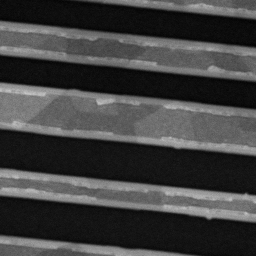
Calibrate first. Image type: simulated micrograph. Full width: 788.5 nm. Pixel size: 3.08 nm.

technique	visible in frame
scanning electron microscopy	one or a few lines or trenches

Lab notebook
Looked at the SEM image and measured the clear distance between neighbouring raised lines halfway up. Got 137 nm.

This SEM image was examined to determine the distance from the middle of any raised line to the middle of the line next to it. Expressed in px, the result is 71.6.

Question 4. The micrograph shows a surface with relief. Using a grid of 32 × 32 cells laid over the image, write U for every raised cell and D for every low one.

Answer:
DDDDDDDDDDDDDDDDDDUUUUUUUUUUUUUU
DDDDDDDDDDDDDDDDDDDDDDDDDDDDUUUU
DDDDDDDDDDDDDDDDDDDDDDDDDDDDDDDD
UUUUDDDDDDDDDDDDDDDDDDDDDDDDDDDD
UUUUUUUUUUUUUUDDDDDDDDDDDDDDDDDD
UUUUUUUUUUUUUUUUUUUUUUUDDDDDDDDD
DUUUUUUUUUUUUUUUUUUUUUUUUUUUUUUU
DDDDDDDDDDDUUUUUUUUUUUUUUUUUUUUU
DDDDDDDDDDDDDDDDDDDDUUUUUUUUUUUU
DDDDDDDDDDDDDDDDDDDDDDDDDDDDDDUU
DDDDDDDDDDDDDDDDDDDDDDDDDDDDDDDD
UUUUUUUDDDDDDDDDDDDDDDDDDDDDDDDD
UUUUUUUUUUUUUUUUDDDDDDDDDDDDDDDD
UUUUUUUUUUUUUUUUUUUUUUUUUUDDDDDD
UUUUUUUUUUUUUUUUUUUUUUUUUUUUUUUU
UUUUUUUUUUUUUUUUUUUUUUUUUUUUUUUU
DDDDDDDDUUUUUUUUUUUUUUUUUUUUUUUU
DDDDDDDDDDDDDDDDDDDUUUUUUUUUUUUU
DDDDDDDDDDDDDDDDDDDDDDDDDDDUUUUU
DDDDDDDDDDDDDDDDDDDDDDDDDDDDDDDD
DDDDDDDDDDDDDDDDDDDDDDDDDDDDDDDD
UDDDDDDDDDDDDDDDDDDDDDDDDDDDDDDD
UUUUUUUUUDDDDDDDDDDDDDDDDDDDDDDD
UUUUUUUUUUUUUUUUUUUDDDDDDDDDDDDD
DDDDDUUUUUUUUUUUUUUUUUUUUUUUDDDD
DDDDDDDDDDDDDDDUUUUUUUUUUUUUUUUU
DDDDDDDDDDDDDDDDDDDDDDDDUUUUUUUU
DDDDDDDDDDDDDDDDDDDDDDDDDDDDDDDD
DDDDDDDDDDDDDDDDDDDDDDDDDDDDDDDD
DDDDDDDDDDDDDDDDDDDDDDDDDDDDDDDD
UUUUUUDDDDDDDDDDDDDDDDDDDDDDDDDD
UUUUUUUUUUUUUUUDDDDDDDDDDDDDDDDD